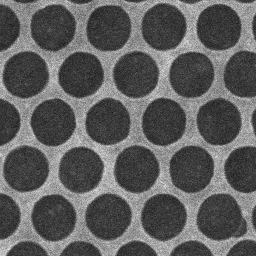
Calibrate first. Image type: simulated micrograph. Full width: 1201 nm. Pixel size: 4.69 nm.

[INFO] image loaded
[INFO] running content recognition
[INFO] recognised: a regular array of holes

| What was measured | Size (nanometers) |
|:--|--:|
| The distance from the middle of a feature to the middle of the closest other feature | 255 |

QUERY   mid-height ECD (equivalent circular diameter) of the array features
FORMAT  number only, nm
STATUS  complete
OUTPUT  216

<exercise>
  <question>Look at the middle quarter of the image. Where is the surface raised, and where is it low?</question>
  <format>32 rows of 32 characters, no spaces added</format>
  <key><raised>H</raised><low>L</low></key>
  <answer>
LLLLLLLLLLHHHLLLLLLLLLLHHHHLLLLL
LLLLLLLLLLHHLLLLLLLLLLLLHHHLLLLL
LLLLLLLLLLHHLLLLLLLLLLLLHHLLLLLL
LLLLLLLLLLHHLLLLLLLLLLLLHHLLLLLL
LLLLLLLLLLHHHLLLLLLLLLLLHHHLLLLL
LLLLLLLLLHHHHLLLLLLLLLLHHHHLLLLL
LLLLLLLLHHHHHHLLLLLLLLHHHHHLLLLL
HLLLLLLHHHHHHHHLLLLLLHHHHHHHLLLL
HHHLLHHHHHLLHHHHHLLHHHHHHHHHHHHL
HHHHHHHHHLLLLLHHHHHHHHLLLLLLHHHH
LHHHHHHLLLLLLLLHHHHHHLLLLLLLLHHH
LLHHHHLLLLLLLLLLHHHHLLLLLLLLLLHH
LLLHHHLLLLLLLLLLHHHHLLLLLLLLLLHH
LLLHHHLLLLLLLLLLLHHLLLLLLLLLLLHH
LLLHHLLLLLLLLLLLLHHLLLLLLLLLLLLH
LLLHHLLLLLLLLLLLLHHLLLLLLLLLLLHH
LLLHHHLLLLLLLLLLLHHHLLLLLLLLLLHH
LLHHHHLLLLLLLLLLHHHHLLLLLLLLLLHH
LHHHHHHLLLLLLLLLHHHHLLLLLLLLLHHH
HHHHHHHHLLLLLLHHHHHHHLLLLLLLHHHH
HHHHHHHHHHHHHHHHHLHHHHHHHHHHHHHL
HLLLLLLHHHHHHHHLLLLLLLHHHHHHHLLL
LLLLLLLLHHHHHHLLLLLLLLLHHHHHLLLL
LLLLLLLLLHHHHLLLLLLLLLLHHHHLLLLL
LLLLLLLLLLHHHLLLLLLLLLLLHHHLLLLL
LLLLLLLLLLHHHLLLLLLLLLLLHHLLLLLL
LLLLLLLLLLHHHLLLLLLLLLLLHHLLLLLL
LLLLLLLLLLHHHLLLLLLLLLLLHHHLLLLL
LLLLLLLLLHHHHLLLLLLLLLLHHHHLLLLL
LLLLLLLLLHHHHLLLLLLLLLLHHHHLLLLL
LLLLLLLLHHHHHHLLLLLLLLHHHHHHLLLL
HLLLLLLHHHHHHHHLLLLLLHHHHHHHHLLL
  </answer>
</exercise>